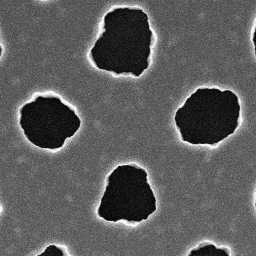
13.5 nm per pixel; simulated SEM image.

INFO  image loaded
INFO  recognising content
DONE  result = holes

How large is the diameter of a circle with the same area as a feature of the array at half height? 798 nanometers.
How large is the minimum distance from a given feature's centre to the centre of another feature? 1470 nanometers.